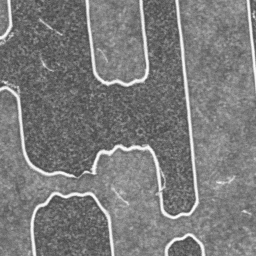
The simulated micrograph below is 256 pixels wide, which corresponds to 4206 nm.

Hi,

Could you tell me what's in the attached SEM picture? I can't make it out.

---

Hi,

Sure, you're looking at one or a few lines or trenches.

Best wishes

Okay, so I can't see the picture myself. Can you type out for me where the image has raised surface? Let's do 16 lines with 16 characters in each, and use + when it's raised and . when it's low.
.++++....++.....
.+++++...++.....
++++++...++.....
++++++...++.....
++++++...+++....
++++++++++++....
.+++++++++++....
.+++++++++++....
.+++++++++++....
..+++++..+++....
..++++....++....
..........++....
...+++....++....
..+++++.........
..+++++.........
..+++++....++...